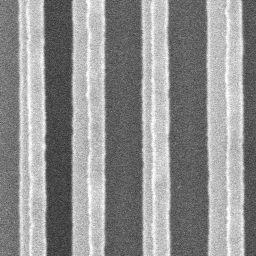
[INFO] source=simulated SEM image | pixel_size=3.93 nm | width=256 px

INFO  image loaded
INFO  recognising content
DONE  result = lines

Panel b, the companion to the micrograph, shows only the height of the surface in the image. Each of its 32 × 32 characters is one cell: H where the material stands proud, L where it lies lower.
LLHHHLLLLHHHHLLLLLHHHLLLLLHHHHLL
LLHHHLLLLHHHHLLLLLHHHLLLLLHHHHLL
LLHHHLLLLHHHHLLLLLHHHLLLLLHHHHLL
LLLHHLLLLHHHHLLLLLHHHLLLLLHHHHLL
LLLHHLLLLHHHHLLLLLHHHLLLLLHHHHLL
LLLHHLLLLHHHHLLLLLHHHLLLLLHHHHLL
LLLHHLLLLHHHHLLLLLHHHLLLLLHHHHLL
LLLHHLLLLHHHHLLLLLHHHLLLLLHHHHLL
LLLHHLLLLHHHHLLLLLHHHLLLLLHHHHLL
LLLHHLLLLHHHHLLLLLHHHLLLLLHHHHLL
LLLHHLLLLHHHHLLLLLHHHLLLLLHHHHLL
LLLHHLLLLHHHHLLLLLHHHLLLLLHHHHLL
LLLHHHLLLHHHHLLLLLHHHLLLLLHHHHLL
LLLHHHLLLHHHHLLLLLHHHLLLLLHHHHLL
LLLHHHLLLHHHHLLLLLHHHLLLLLHHHHLL
LLLHHHLLLHHHHLLLLLHHHLLLLLHHHHLL
LLLHHHLLLHHHHLLLLLHHHLLLLLHHHHLL
LLLHHHLLLHHHHLLLLLHHHLLLLLHHHHLL
LLLHHHLLLHHHHLLLLLHHHLLLLLHHHHLL
LLLHHLLLLHHHHLLLLLHHHLLLLLHHHHLL
LLLHHHLLLHHHHLLLLLHHHLLLLLHHHHLL
LLLHHHLLLHHHHLLLLLHHHLLLLLHHHHLL
LLLHHHLLLHHHHLLLLLHHHLLLLLHHHHLL
LLLHHHLLLHHHHLLLLLHHHLLLLLHHHHLL
LLLHHHLLLHHHHLLLLLHHHLLLLLHHHHLL
LLLHHHLLLHHHHLLLLLHHHLLLLLHHHHLL
LLLHHHLLLHHHHLLLLLHHHLLLLLHHHHLL
LLLHHHLLLHHHHLLLLLHHHLLLLLHHHHLL
LLLHHHLLLHHHHLLLLLHHHLLLLLHHHHLL
LLLHHHLLLHHHHLLLLLHHHLLLLLHHHHLL
LLLHHHLLLHHHHLLLLLHHHLLLLLHHHHLL
LLLHHHLLLHHHHLLLLLHHHLLLLLHHHHLL